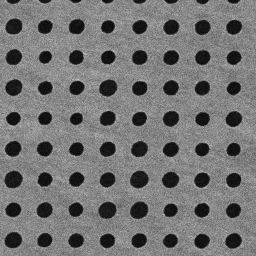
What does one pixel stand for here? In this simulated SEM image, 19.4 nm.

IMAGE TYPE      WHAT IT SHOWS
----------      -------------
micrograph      a regular array of holes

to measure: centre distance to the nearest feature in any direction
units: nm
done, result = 590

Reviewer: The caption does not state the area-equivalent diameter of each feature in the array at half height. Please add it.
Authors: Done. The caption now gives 0.297 microns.